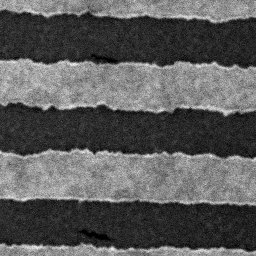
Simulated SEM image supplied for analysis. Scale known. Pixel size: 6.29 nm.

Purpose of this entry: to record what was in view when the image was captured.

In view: one or a few lines or trenches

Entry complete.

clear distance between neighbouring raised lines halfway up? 47.7 px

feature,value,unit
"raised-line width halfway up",44.8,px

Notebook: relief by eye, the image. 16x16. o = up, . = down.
oooooooooooooooo
................
................
................
oooooooooooooooo
oooooooooooooooo
.ooooooooooooooo
................
................
...ooo..........
oooooooooooooooo
oooooooooooooooo
.......o.ooooooo
................
................
oooooo..........